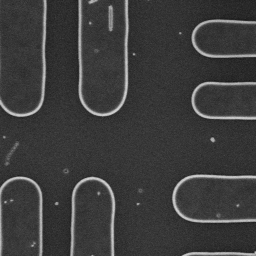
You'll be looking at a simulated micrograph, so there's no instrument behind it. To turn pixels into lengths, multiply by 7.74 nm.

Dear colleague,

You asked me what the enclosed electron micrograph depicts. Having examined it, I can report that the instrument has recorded groups of lines, slits or small figures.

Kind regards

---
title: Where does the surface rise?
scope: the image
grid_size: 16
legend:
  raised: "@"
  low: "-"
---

@@@--@@@--------
@@@--@@@-----@@@
@@@--@@@----@@@@
@@@--@@@-----@@-
@@@--@@@--------
@@@--@@@----@@@@
@@@--@@@----@@@@
----------------
----------------
----------------
----------------
@@---@@----@@@@@
@@@--@@----@@@@@
@@@--@@----@@@@@
@@@--@@---------
@@@-@@@---------